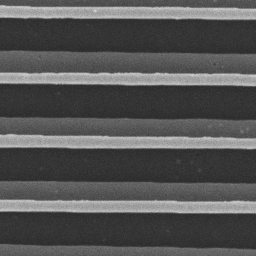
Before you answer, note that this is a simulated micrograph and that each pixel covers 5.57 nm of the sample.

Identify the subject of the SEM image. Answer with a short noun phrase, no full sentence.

lines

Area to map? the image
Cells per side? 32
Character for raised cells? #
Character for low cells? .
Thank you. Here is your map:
################################
################################
................................
................................
................................
................................
#########.......................
################################
################################
################################
...............#################
................................
................................
................................
................................
################################
################################
################################
..............................##
................................
................................
................................
................................
################################
################################
################################
......................##########
................................
................................
................................
................................
################################